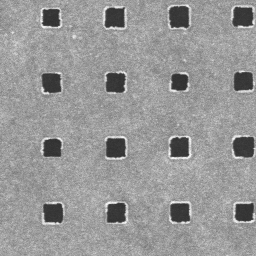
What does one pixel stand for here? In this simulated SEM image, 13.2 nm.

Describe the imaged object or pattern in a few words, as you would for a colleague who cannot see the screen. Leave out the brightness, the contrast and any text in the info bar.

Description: a regular array of holes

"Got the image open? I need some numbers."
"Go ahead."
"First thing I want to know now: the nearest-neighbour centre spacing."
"839 nm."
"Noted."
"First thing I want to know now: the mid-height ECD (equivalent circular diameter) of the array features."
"283 nm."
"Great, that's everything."